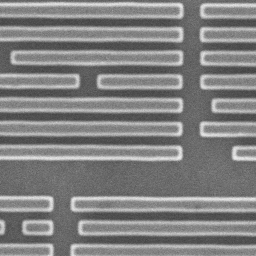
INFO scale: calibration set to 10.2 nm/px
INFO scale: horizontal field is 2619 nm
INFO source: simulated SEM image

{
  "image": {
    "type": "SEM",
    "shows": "groups of lines, slits or small figures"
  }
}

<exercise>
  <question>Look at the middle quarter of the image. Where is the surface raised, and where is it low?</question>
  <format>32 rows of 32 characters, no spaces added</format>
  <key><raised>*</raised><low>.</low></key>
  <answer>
................................
................................
................................
****.....********************...
****.....********************...
***......********************...
................................
................................
................................
*****************************...
*****************************...
*****************************...
................................
................................
................................
*****************************...
*****************************...
*****************************...
................................
................................
................................
*****************************...
*****************************...
*****************************...
................................
................................
................................
................................
................................
................................
................................
................................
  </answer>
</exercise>